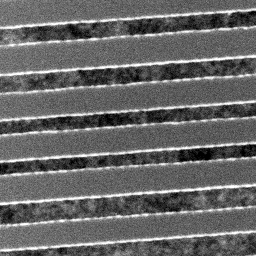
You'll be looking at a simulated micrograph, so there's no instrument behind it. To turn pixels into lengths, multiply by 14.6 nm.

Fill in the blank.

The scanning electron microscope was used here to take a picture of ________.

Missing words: lines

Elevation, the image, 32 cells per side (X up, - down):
XXXXXXXXXXXXXXXXXXXXXXXXXXXXXXXX
XXXXXXXXXXXXXXXXXXXXXXXXXXXXX---
XXXXXXXXXXXXXXX-----------------
-----------------------------XXX
-----------------XXXXXXXXXXXXXXX
---XXXXXXXXXXXXXXXXXXXXXXXXXXXXX
XXXXXXXXXXXXXXXXXXXXXXXXXXXXXXXX
XXXXXXXXXXXXXXXXXXXXXXXXXXX-----
XXXXXXXXXXXXX-------------------
-----------------------------XXX
----------------XXXXXXXXXXXXXXXX
----XXXXXXXXXXXXXXXXXXXXXXXXXXXX
XXXXXXXXXXXXXXXXXXXXXXXXXXXXXXXX
XXXXXXXXXXXXXXXXXXXXXX----------
XXXXXXX-------------------------
-------------------XXXXXXXXXXXXX
-----XXXXXXXXXXXXXXXXXXXXXXXXXXX
XXXXXXXXXXXXXXXXXXXXXXXXXXXXXXXX
XXXXXXXXXXXXXXXXXXXXXXXX--------
XXXXXXXXXXX---------------------
----------------------XXXXXXXXXX
------XXXXXXXXXXXXXXXXXXXXXXXXXX
XXXXXXXXXXXXXXXXXXXXXXXXXXXXXXXX
XXXXXXXXXXXXXXXXXXXXXXXXXXX-----
XXXXXXXXXXXXXX------------------
X-------------------------------
------------------------XXXXXXXX
---------XXXXXXXXXXXXXXXXXXXXXXX
XXXXXXXXXXXXXXXXXXXXXXXXXXXXXXXX
XXXXXXXXXXXXXXXXXXXXXXXX--------
XXXXXXXXXXXX--------------------
--------------------------------